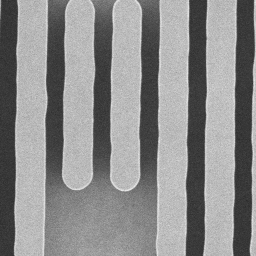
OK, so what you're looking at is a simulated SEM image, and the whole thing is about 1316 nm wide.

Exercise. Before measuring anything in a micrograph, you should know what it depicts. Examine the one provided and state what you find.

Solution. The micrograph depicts groups of lines, slits or small figures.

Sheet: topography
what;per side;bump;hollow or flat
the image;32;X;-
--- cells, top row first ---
--XXXX---XXX--XXX---XXXX--XXXX--
--XXXX--XXXX--XXXX--XXXX--XXXX--
--XXXX--XXXX--XXXX--XXXX--XXXX--
--XXXX--XXXX--XXXX--XXXX--XXXX--
--XXXX--XXXX--XXXX--XXXX--XXXX--
--XXXX--XXXX--XXXX--XXXX--XXXX--
--XXXX--XXXX--XXXX--XXXX--XXX---
--XXXX--XXXX--XXXX--XXX---XXX---
--XXXX--XXXX--XXXX--XXX---XXX---
--XXXX--XXXX--XXXX--XXX---XXX---
--XXXX--XXXX--XXXX--XXX---XXX---
--XXXX--XXXX--XXXX--XXX---XXX---
--XXXX--XXXX--XXX---XXX---XXX---
--XXXX--XXXX--XXXX--XXX---XXX---
--XXXX--XXXX--XXX---XXX---XXX---
--XXXX--XXXX--XXX---XXX---XXX---
--XXXX--XXXX--XXX---XXX---XXX---
--XXXX--XXXX--XXX---XXX---XXX---
--XXXX--XXXX--XXX---XXX---XXX---
--XXXX--XXX---XXX---XXX---XXX---
--XXXX--XXX---XXX---XXX---XXX---
--XXXX--XXX---XXX---XXX---XXX---
--XXXX--XXX---XXX---XXX---XXX---
--XXXX---X-----XX---XXX---XXX---
--XXXX--------------XXX---XXX---
--XXXX--------------XXX---XXX---
--XXXX--------------XXX---XXX---
--XXXX--------------XXX---XXX---
--XXX---------------XXX---XXX---
--XXX---------------XXX---XXX--X
--XXX---------------XXX---XXX--X
--XXX---------------XXX--XXXX--X